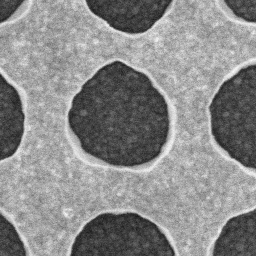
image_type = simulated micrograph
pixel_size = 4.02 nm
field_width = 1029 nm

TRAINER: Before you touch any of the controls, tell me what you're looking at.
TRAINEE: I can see holes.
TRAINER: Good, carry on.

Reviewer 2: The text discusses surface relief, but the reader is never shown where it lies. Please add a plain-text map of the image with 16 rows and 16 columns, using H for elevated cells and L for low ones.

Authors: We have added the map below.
LLHHHHLLLLLHHHLL
HHHHHHHLLLHHHHHH
HHHHHHHHHHHHHHHH
HHHHHHHHHHHHHHHH
HHHHHHLLLHHHHHHL
LHHHHLLLLLHHHHLL
LHHHLLLLLLHHHLLL
LLHHLLLLLLLHHLLL
LHHHLLLLLLLHHLLL
LHHHHLLLLLHHHHLL
HHHHHHHHLHHHHHHH
HHHHHHHHHHHHHHHH
HHHHHHHHHHHHHHHH
HHHHHHLLLHHHHHHL
LHHHHLLLLLHHHHLL
LLHHLLLLLLLHHLLL